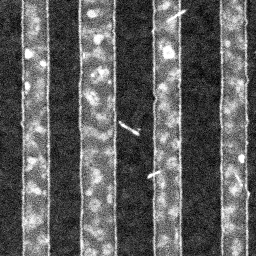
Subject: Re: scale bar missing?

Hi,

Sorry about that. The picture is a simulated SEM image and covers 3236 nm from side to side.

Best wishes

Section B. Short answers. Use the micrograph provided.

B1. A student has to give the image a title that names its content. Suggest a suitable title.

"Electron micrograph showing one or a few lines or trenches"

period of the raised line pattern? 861 nm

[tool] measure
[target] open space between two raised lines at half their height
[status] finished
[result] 0.317 um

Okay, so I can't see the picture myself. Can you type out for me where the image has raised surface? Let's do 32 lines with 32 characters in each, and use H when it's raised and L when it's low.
HHHLLLHHHHLLLLHHHHHLLLHHHHHHLLLH
HHHLLLHHHHLHLLHHHHHLLLHHHHHHLLLH
HHHLLLHHHHLLLLHHHHHLLLHHHHHHLLLH
HHHLLLHHHHLLLLHHHHHLLLHHHHHHLLLH
HHHLLLHHHHLLLLHHHHHLLLHHHHHHLLLH
HHHLLLHHHHLLLLHHHHHLLLLHHHHHLLLH
HHHLLLHHHHLLLLHHHHHLLHLHHHHHLLLH
HHHLLLHHHHLLLLHHHHHLLLLHHHHHLLLH
HHHLLLHHHHLLLLHHHHHLLLHHHHHHLLLH
HHHLLLHHHHLLLLHHHHHLLLLHHHHHLLLH
HHHLLLHHHHLLLLHHHHHLLLHHHHHHLLLH
HHHLLLHHHHLLLLHHHHHLLLLHHHHHLLLH
HHHLLLHHHHLLLLHHHHHHLLLHHHHHLLLH
HHHLLLHHHHLLLLHHHHHLLLLHHHHHLLLH
HHHLLLHHHHLLLLHHHHHLLLHHHHHHLLLH
HHHLLLHHHHLLLLHHHHHLLLHHHHHHLLLH
HHHLLLHHHHLLLLHHHHHLLLLHHHHHLLLH
HHHLLLHHHHLLLLHHHHHLLLLHHHHHLLLH
HHHLLLHHHHLLLLHHHHHLLLLHHHHHLLLH
HHHLLLHHHHLLLLHHHHHLLLHHHHHHLLHH
HHHLLLHHHHLLLLHHHHHLLLLHHHHHLLLH
HHHLLLHHHHLLLLHHHHHLLLLHHHHHLLLH
HHHLLLHHHHLLLLHHHHHLLLLHHHHHLLLH
HHHLLLHHHHLLLLHHHHHLLLLHHHHHLLLH
HHHLLLHHHHLLLLHHHHHLLLLHHHHHLLLH
HHHLLLHHHHLLLLHHHHHLLLLHHHHHLLLH
HHHLLLHHHHLLLLHHHHHLLLLHHHHHLLLH
HHHLLLHHHHLLLLHHHHHLLLLHHHHHLLLH
HHHLLLHHHHLLLLHHHHHLLLLHHHHHLLLH
HHHLLLHHHHLLLLHHHHHLLLHHHHHHLLLH
HHHLLLHHHHLLLLHHHHHLLLLHHHHHLLLH
HHHLLLHHHHLLLLHHHHHLLLLHHHHHLLLH